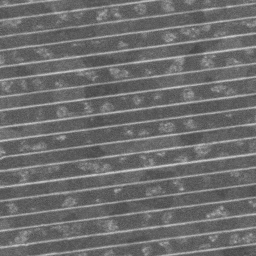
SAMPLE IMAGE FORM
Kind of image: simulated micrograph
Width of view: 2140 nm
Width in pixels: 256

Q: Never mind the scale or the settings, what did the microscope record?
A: parallel lines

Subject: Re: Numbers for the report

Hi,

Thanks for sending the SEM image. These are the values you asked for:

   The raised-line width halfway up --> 114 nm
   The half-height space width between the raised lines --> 130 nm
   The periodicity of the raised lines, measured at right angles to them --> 249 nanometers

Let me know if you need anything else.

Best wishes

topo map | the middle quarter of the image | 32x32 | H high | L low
HHHHHHHHHHHHLLLLLLLLLLLLLLLLLLLL
HHHHLLLLLLLLLLLLLLLLLLLLLLLLLLLL
LLLLLLLLLLLLLLLLLLLLLLLLLLLHHHHH
LLLLLLLLLLLLLLLLLLLLHHHHHHHHHHHH
LLLLLLLLLLLLHHHHHHHHHHHHHHHHHHHH
LLLLLHHHHHHHHHHHHHHHHHHHHHHHHHLL
HHHHHHHHHHHHHHHHHHHHHHLLLLLLLLLL
HHHHHHHHHHHHHHHLLLLLLLLLLLLLLLLL
HHHHHHHLLLLLLLLLLLLLLLLLLLLLLLLL
LLLLLLLLLLLLLLLLLLLLLLLLLLLLLLLL
LLLLLLLLLLLLLLLLLLLLLLLLLHHHHHHH
LLLLLLLLLLLLLLLLLHHHHHHHHHHHHHHH
LLLLLLLLLHHHHHHHHHHHHHHHHHHHHHHH
LLHHHHHHHHHHHHHHHHHHHHHHHHHLLLLL
HHHHHHHHHHHHHHHHHHHLLLLLLLLLLLLL
HHHHHHHHHHHHLLLLLLLLLLLLLLLLLLLL
HHHHLLLLLLLLLLLLLLLLLLLLLLLLLLLL
LLLLLLLLLLLLLLLLLLLLLLLLLLLLLLHH
LLLLLLLLLLLLLLLLLLLLLLHHHHHHHHHH
LLLLLLLLLLLLLHHHHHHHHHHHHHHHHHHH
LLLLLLLHHHHHHHHHHHHHHHHHHHHHHHHH
HHHHHHHHHHHHHHHHHHHHHHHHLLLLLLLL
HHHHHHHHHHHHHHHHHLLLLLLLLLLLLLLL
HHHHHHHHHLLLLLLLLLLLLLLLLLLLLLLL
HLLLLLLLLLLLLLLLLLLLLLLLLLLLLLLL
LLLLLLLLLLLLLLLLLLLLLLLLLHHHHHHH
LLLLLLLLLLLLLLLLLHHHHHHHHHHHHHHH
LLLLLLLLLLHHHHHHHHHHHHHHHHHHHHHH
LLHHHHHHHHHHHHHHHHHHHHHHHHHLLLLL
HHHHHHHHHHHHHHHHHHHHLLLLLLLLLLLL
HHHHHHHHHHHHLLLLLLLLLLLLLLLLLLLL
HHHHLLLLLLLLLLLLLLLLLLLLLLLLLLLL